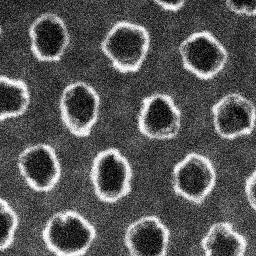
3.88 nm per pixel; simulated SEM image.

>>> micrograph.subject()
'a regular array of raised bodies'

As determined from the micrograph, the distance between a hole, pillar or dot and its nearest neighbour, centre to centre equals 280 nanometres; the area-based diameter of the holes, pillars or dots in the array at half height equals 160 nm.